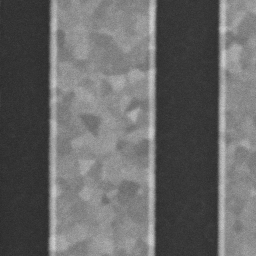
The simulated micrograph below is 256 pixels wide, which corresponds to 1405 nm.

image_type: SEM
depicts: one or a few lines or trenches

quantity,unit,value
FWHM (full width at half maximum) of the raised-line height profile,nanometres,551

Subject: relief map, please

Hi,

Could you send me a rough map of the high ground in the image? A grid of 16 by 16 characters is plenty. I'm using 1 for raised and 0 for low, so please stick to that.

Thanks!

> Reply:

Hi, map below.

0001111111000011
0001111111000011
0001111111000011
0001111111000011
0001111111000011
0001111111000011
0001111111000011
0001111111000011
0001111111000011
0001111111000011
0001111111000011
0001111111000011
0001111111000011
0001111110000011
0001111111000011
0001111110000011